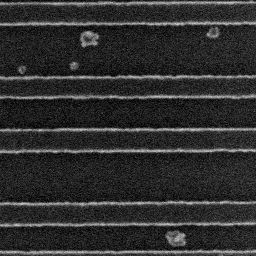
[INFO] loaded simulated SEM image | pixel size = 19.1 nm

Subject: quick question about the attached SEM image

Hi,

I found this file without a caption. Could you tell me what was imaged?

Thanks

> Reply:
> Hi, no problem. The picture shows lines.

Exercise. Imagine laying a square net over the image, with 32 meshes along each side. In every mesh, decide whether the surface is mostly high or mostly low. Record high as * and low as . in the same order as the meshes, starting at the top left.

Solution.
********************************
********************************
********************************
................................
...........*....................
................................
................................
................................
................................
................................
********************************
********************************
................................
................................
................................
................................
********************************
********************************
********************************
................................
................................
................................
................................
................................
................................
********************************
********************************
********************************
................................
.....................*..........
................................
***.****************************